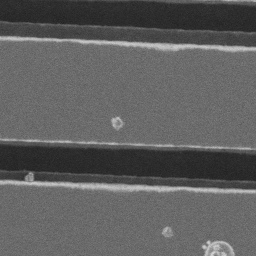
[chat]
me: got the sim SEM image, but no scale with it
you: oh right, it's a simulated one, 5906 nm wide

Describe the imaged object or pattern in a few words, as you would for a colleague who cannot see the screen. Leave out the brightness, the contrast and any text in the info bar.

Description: lines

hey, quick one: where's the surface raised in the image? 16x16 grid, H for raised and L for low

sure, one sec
LLLLLLLLLLLLLLLL
LLLLLLLLLLLLLLLL
HHHHHHLLLLLLLLLL
HHHHHHHHHHHHHHHH
HHHHHHHHHHHHHHHH
HHHHHHHHHHHHHHHH
HHHHHHHHHHHHHHHH
HHHHHHHHHHHHHHHH
HHHHHHHHHHHHHHHH
LLLLLLLLLLLLLLLL
LLLLLLLLLLLLLLLL
HHHHHHHLLLLLLLLL
HHHHHHHHHHHHHHHH
HHHHHHHHHHHHHHHH
HHHHHHHHHHHHHHHH
HHHHHHHHHHHHHHHH